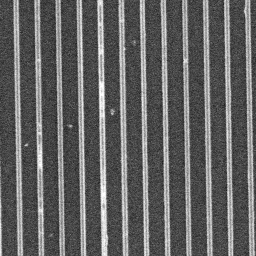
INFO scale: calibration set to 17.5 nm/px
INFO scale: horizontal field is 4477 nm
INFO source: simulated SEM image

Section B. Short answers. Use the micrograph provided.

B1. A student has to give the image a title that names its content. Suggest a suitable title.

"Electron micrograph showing parallel lines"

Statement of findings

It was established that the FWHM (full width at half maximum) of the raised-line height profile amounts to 74.3 nm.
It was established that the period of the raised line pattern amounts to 368 nanometres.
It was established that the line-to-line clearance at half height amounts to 297 nm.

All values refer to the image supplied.